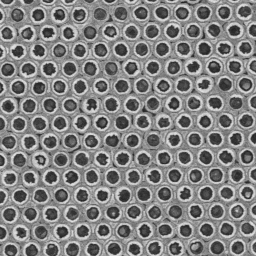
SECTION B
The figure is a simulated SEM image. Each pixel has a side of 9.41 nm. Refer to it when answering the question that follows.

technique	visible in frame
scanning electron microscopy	a regular array of holes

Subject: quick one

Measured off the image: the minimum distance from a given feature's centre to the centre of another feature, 189 nanometers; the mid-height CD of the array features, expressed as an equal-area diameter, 109 nm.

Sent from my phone